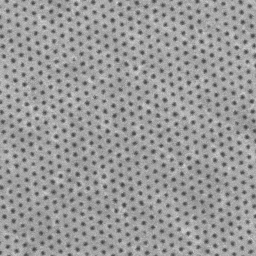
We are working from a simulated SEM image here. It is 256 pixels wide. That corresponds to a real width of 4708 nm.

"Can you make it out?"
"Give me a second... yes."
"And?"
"a regular array of holes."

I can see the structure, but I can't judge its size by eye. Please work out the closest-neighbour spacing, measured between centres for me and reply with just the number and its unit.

177 nanometers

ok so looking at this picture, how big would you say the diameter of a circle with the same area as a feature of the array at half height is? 0.088 microns